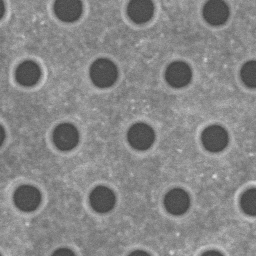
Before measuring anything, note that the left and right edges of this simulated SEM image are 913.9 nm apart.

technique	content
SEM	a regular array of holes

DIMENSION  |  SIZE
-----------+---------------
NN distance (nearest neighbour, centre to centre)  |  259 nanometers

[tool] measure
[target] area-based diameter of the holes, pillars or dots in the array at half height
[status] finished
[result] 0.112 µm